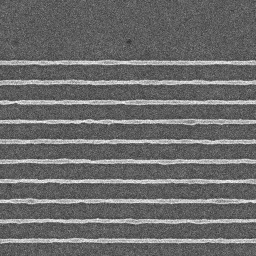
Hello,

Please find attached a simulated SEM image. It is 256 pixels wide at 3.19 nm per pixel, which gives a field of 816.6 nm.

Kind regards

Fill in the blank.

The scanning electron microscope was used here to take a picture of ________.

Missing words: parallel lines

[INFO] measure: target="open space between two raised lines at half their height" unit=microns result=0.0519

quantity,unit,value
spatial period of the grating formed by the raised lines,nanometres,63.2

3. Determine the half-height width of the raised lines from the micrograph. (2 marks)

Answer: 10.8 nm